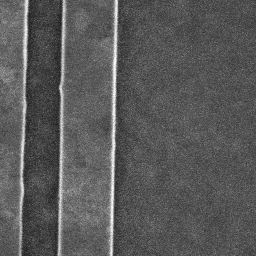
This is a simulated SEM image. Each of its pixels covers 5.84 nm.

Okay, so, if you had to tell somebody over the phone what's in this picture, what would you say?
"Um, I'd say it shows one or a few lines or trenches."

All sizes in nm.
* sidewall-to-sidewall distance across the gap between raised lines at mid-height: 215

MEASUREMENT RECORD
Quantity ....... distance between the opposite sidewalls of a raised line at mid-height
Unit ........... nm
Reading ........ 311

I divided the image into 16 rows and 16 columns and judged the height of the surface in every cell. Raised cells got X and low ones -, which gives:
XX--XXX---------
XX--XXX---------
XX--XXX---------
XX--XXX---------
XX--XXX---------
XX--XXX---------
XX--XXX---------
X---XXX---------
X---XXX---------
X---XXX---------
X---XXX---------
X---XXX---------
X---XXX---------
X---XXX---------
X---XXX---------
X---XXX---------